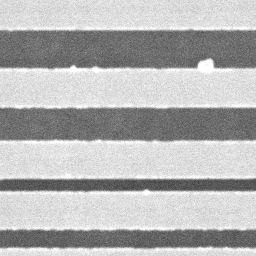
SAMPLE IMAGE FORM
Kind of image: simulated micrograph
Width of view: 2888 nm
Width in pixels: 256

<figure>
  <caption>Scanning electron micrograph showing lines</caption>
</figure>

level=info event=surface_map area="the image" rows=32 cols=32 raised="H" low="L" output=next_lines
HHHHHHHHHHHHHHHHHHHHHHHHHHHHHHHH
HHHHHHHHHHHHHHHHHHHHHHHHHHHHHHHH
HHHHHHHHHHHHHHHHHHHHHHHHHHHHHHHH
HHHHHHHHHHHHHHHHHHHHHHHHHHHHHHHH
LLLLLLLLLLLLLLLLLLLLLLLLLLLLLLLL
LLLLLLLLLLLLLLLLLLLLLLLLLLLLLLLL
LLLLLLLLLLLLLLLLLLLLLLLLLLLLLLLL
LLLLLLLLLLLLLLLLLLLLLLLLLLLLLLLL
LLLLLLLLLHLLLLLLLLLLLLLLHHHLLLLL
HHHHHHHHHHHHHHHHHHHHHHHHHHHHHHHH
HHHHHHHHHHHHHHHHHHHHHHHHHHHHHHHH
HHHHHHHHHHHHHHHHHHHHHHHHHHHHHHHH
HHHHHHHHHHHHHHHHHHHHHHHHHHHHHHHH
LLLLLLLLLLLLLLLLLLLLLLLLLLLLLLLL
LLLLLLLLLLLLLLLLLLLLLLLLLLLLLLLL
LLLLLLLLLLLLLLLLLLLLLLLLLLLLLLLL
LLLLLLLLLLLLLLLLLLLLLLLLLLLLLLLL
LLLLLLLLLLLLLLLLLLLLLLLLLLLLLLLL
HHHHHHHHHHHHHHHHHHHHHHHHHHHHHHHH
HHHHHHHHHHHHHHHHHHHHHHHHHHHHHHHH
HHHHHHHHHHHHHHHHHHHHHHHHHHHHHHHH
HHHHHHHHHHHHHHHHHHHHHHHHHHHHHHHH
LLLLLLLLLLLLLLLLLLLLLLLLLLLLLLLL
LLLLLLLLLLLLLLLLLLLLLLLLLLLLLLLL
HHHHHHHHHHHHHHHHHHHHHHHHHHHHHHHH
HHHHHHHHHHHHHHHHHHHHHHHHHHHHHHHH
HHHHHHHHHHHHHHHHHHHHHHHHHHHHHHHH
HHHHHHHHHHHHHHHHHHHHHHHHHHHHHHHH
HHHHHHHHHHHHHHHHHHHHHHHHHHHHHHHH
LLLLLLLLLLLLLLLLLLLLLLLLLLLLLLLL
LLLLLLLLLLLLLLLLLLLLLLLLLLLLLLLL
HHHHHHHHHHHHHHHHHHHHHHHHHHHHHHHH